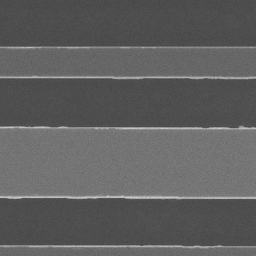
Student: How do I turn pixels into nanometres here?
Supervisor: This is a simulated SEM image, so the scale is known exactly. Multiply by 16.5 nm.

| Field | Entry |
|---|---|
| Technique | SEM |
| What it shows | lines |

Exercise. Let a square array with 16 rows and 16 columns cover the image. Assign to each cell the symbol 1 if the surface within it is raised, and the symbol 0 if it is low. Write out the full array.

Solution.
0000000000000000
0000000000000000
0000000000000000
1111111111111111
1111111111111111
0000000000000000
0000000000000000
0000000000000000
1111111111111111
1111111111111111
1111111111111111
1111111111111111
0000000000000000
0000000000000000
0000000000000000
1111111111111111